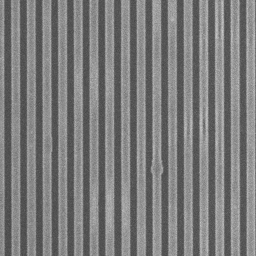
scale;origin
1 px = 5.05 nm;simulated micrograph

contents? parallel lines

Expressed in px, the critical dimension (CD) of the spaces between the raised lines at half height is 7.13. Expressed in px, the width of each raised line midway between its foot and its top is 8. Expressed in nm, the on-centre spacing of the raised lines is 79.2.